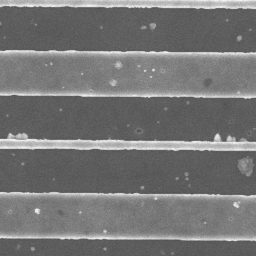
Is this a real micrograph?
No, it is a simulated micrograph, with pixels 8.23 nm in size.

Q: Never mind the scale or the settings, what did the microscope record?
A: lines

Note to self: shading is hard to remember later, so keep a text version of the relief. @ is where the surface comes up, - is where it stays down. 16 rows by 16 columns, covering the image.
------------@@@@
----------------
----------------
@@@@@@@@@@@@@@@@
@@@@@@@@@@@@@@@@
@@@@@@@@@@@@@@@@
----------------
----------------
----------------
----------------
----------------
----------------
@@@@@@@@@@@@@@@@
@@@@@@@@@@@@@@@@
@@@@@@@@@@@@@@@@
----------------